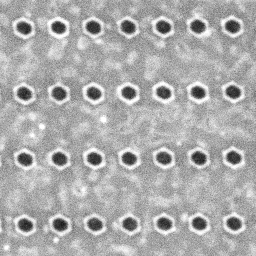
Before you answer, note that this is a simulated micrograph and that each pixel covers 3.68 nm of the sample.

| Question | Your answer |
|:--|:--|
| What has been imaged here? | a regular array of raised bodies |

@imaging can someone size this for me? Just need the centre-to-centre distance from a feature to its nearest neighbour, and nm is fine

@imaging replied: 128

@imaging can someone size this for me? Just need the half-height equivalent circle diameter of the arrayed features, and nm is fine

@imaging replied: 71.4